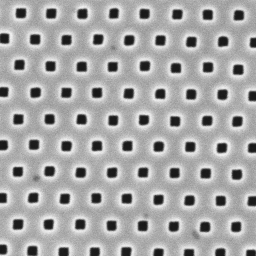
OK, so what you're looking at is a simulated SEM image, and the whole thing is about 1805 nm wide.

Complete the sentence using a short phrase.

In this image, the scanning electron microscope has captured a regular array of holes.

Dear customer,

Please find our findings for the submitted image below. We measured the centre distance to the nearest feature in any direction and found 213 nanometres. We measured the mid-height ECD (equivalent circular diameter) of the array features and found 81.9 nm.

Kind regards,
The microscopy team